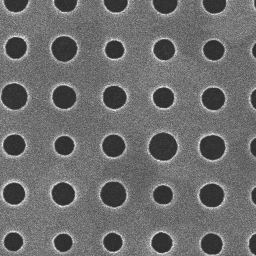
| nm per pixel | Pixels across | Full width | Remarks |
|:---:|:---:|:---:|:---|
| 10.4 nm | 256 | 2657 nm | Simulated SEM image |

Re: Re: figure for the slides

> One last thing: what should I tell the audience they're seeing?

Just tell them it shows a regular array of holes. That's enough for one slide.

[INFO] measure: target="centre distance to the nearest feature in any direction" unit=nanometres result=501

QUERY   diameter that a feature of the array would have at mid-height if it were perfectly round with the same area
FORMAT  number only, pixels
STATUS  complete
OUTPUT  22.2